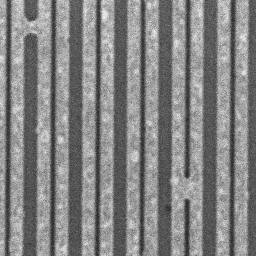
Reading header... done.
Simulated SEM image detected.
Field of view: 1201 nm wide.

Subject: parallel lines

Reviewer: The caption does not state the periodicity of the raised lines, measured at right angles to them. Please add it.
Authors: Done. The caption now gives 105 nm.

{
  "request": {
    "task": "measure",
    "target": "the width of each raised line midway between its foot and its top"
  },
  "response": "12.3 px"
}